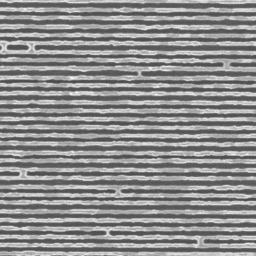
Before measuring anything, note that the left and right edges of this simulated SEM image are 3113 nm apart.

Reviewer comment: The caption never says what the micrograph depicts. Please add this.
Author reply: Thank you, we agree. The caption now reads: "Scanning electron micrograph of parallel lines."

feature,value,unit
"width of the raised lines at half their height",4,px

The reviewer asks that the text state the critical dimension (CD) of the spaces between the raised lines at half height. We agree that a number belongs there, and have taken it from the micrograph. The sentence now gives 48.6 nm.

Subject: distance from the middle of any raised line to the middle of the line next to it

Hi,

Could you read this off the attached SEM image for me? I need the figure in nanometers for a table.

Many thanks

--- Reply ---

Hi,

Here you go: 102